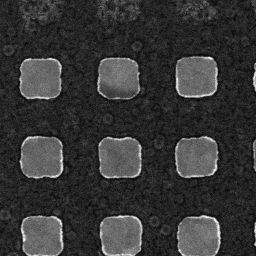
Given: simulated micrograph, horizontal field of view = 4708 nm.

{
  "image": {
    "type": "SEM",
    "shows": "raised bodies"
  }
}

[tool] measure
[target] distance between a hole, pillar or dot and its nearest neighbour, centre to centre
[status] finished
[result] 1430 nanometers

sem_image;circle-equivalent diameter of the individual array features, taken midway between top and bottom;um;0.808